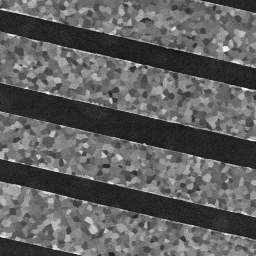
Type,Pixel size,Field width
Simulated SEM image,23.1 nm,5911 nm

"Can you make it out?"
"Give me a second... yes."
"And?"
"one or a few lines or trenches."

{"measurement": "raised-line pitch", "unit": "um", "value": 1.73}